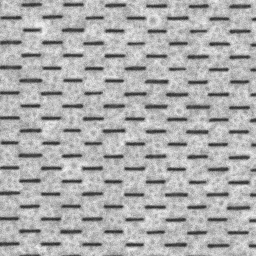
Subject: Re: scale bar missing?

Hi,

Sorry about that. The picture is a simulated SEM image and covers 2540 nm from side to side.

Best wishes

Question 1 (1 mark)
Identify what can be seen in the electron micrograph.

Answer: a regular array of holes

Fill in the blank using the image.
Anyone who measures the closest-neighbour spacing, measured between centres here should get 237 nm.